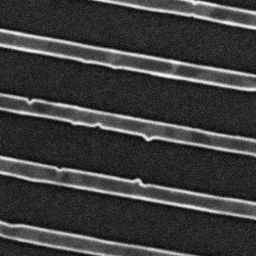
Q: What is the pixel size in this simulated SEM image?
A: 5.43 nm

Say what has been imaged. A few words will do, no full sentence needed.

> parallel lines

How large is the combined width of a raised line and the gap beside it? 340 nm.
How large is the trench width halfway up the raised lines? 260 nm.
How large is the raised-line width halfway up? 0.0781 um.